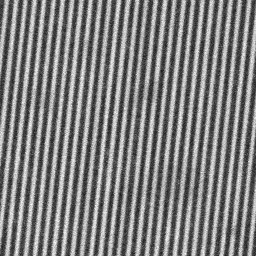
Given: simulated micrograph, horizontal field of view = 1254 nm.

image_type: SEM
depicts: parallel lines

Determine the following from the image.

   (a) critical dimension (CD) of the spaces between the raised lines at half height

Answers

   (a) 29.8 nanometers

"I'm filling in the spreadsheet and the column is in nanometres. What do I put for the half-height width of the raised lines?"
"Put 17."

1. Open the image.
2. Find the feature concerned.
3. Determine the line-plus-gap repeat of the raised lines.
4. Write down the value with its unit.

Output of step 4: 45.4 nanometers